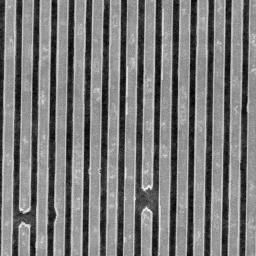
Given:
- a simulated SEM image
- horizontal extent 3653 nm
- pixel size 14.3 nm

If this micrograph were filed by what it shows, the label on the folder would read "parallel lines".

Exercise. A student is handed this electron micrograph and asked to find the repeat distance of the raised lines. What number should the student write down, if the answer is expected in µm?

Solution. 0.249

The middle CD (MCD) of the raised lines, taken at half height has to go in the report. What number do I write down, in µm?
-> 0.148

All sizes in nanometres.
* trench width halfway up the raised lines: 107